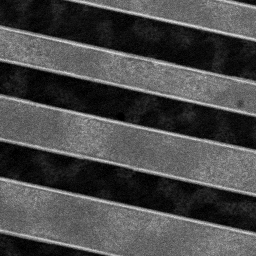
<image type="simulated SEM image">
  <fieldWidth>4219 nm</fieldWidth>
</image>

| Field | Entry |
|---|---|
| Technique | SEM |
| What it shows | one or a few lines or trenches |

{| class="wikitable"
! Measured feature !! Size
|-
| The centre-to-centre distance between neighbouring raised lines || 1240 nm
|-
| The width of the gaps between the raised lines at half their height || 658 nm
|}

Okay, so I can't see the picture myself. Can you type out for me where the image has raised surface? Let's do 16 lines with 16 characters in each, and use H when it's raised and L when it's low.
LLLLLLLHHHHHHHHH
LLLLLLLLLLLHHHHH
HHHLLLLLLLLLLLLL
HHHHHHHHLLLLLLLL
LLLLHHHHHHHHHLLL
LLLLLLLLHHHHHHHH
HHLLLLLLLLLLLHHH
HHHHHHLLLLLLLLLL
HHHHHHHHHHHLLLLL
LLLLHHHHHHHHHHHH
LLLLLLLLHHHHHHHH
HLLLLLLLLLLLLHHH
HHHHHHLLLLLLLLLL
HHHHHHHHHHLLLLLL
HHHHHHHHHHHHHHHL
LLLLLHHHHHHHHHHH